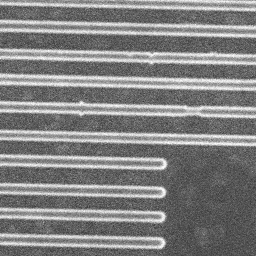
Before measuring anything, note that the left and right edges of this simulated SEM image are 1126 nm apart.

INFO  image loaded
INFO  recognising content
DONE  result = parallel lines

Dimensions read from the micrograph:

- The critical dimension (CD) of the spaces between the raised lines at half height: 77.5 nm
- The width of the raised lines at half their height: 34.6 nm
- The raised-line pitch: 118 nm